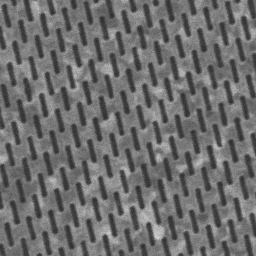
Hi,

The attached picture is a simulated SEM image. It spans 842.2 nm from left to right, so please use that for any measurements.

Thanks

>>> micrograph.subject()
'a regular array of holes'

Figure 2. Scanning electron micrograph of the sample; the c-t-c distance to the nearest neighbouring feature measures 71.9 nm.